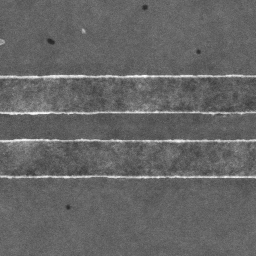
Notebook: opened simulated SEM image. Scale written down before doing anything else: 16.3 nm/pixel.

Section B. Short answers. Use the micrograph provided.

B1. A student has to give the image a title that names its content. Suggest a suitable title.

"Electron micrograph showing lines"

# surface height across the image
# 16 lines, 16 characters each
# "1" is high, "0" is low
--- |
0000000000000000
0000000000000000
0000000000000000
0000000000000000
0000000000000000
1111111111111111
1111111111111111
0000000000000000
0000000000000000
1111111111111111
1111111111111111
0000000000000000
0000000000000000
0000000000000000
0000000000000000
0000000000000000